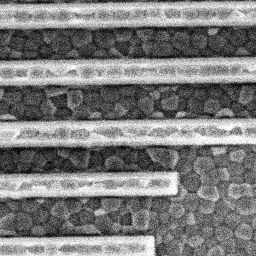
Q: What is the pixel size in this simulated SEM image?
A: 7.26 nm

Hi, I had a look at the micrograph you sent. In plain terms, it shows parallel lines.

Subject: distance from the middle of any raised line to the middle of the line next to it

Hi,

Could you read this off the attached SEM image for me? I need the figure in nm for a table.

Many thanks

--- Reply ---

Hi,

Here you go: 415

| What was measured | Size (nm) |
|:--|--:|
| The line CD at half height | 137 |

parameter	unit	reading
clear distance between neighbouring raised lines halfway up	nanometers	274